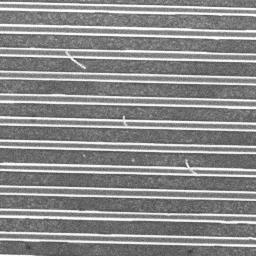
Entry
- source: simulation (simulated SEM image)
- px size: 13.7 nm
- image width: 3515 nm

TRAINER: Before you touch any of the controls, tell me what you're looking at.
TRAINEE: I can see parallel lines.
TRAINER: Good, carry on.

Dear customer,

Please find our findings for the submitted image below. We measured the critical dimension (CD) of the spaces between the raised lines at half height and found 218 nm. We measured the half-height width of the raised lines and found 97.8 nm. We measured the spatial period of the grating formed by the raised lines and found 316 nm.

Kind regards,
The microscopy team